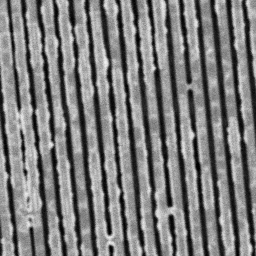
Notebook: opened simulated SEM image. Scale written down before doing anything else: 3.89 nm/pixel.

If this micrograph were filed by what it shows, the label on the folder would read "parallel lines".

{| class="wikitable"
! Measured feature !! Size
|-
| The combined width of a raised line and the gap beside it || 0.061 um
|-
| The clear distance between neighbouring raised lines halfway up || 20.3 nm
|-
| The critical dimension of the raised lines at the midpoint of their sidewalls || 37.2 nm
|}